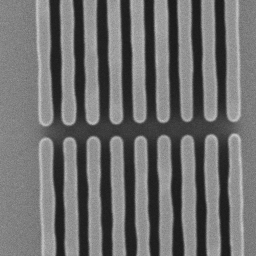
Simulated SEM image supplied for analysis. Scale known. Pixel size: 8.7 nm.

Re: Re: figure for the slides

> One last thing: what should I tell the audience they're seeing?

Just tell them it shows groups of lines, slits or small figures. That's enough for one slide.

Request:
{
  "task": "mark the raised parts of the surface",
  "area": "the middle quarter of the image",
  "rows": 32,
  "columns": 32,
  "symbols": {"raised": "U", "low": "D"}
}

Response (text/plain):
UUDDDUUUDDDUUUDDDUUUDDDUUUDDDUUU
UUDDDUUUDDDDUUDDDUUUDDDUUUDDDUUU
UUDDDUUUDDDDUUDDDUUUDDDUUUDDDUUU
UUDDDDUUDDDDUUDDDUUUDDDUUUDDDUUU
UUDDDDUUDDDDUUDDDUUUDDDUUUDDDUUU
UUDDDUUUUDDDUUDDDUUUDDDUUUDDDUUU
UUDDDUUUUDDDUUDDDUUUDDDUUUDDDUUU
UUDDDUUUUDDDUUDDDUUUDDDUUUDDDUUU
UUUDDUUUUDDDUUDDDUUUDDDUUUDDDUUU
UUUDDUUUUDDDUUDDDUUUDDDUUUDDDUUU
UUUDDUUUUDDDUUDDDUUUDDDUUUDDDUUU
UUUDDUUUUDDDUUUDDUUUDDDUUUDDDUUU
UUUDDDUUUDDDUUUDDDUUDDDUUUDDDDUU
UUUDDDUUUDDDUUUDDDUUDDDUUUDDDDUU
UUDDDDUUDDDDUUDDDDUDDDDDDDDDDDDD
DDDDDDDDDDDDDDDDDDDDDDDDDDDDDDDD
DDDDDDDDDDDDDDDDDDDDDDDDDDDDDDDD
DDDDDDDDDDDDDDDDDDDDDDDDDDDDDDDD
DDDDDDDUDDDDUUDDDDUUDDDDUUDDDDUU
UUUDDDUUUDDDUUUDDDUUDDDUUUUDDUUU
UUUDDDUUUDDDUUUDDDUUDDDUUUUDDUUU
UUUDDDUUUDDDUUUDDDUUUDDUUUUDDUUU
UUUDDDUUUDDDUUUDDDUUUDDDUUUDDUUU
UUUDDDUUUDDDUUUDDDUUUDDDUUUDDDUU
UUUDDDUUUDDDUUUDDDUUUDDUUUUDDDUU
UUUDDDUUUDDDUUUDDDUUUDDUUUUDDDUU
UUUDDDUUUDDDUUUDDDUUUDDUUUUDDDUU
UUUDDDUUUDDDUUUDDDUUUDDDUUUDDDUU
UUUDDDUUUDDDUUUDDDUUUDDDUUUDDDUU
UUUDDDUUUDDDUUUDDDUUUDDDUUUDDDUU
UUUDDDUUUDDDUUUDDDUUUDDDUUUDDDUU
UUUDDDUUUDDDUUUDDDUUUDDDUUUDDDUU